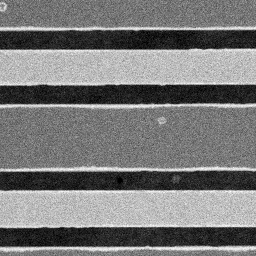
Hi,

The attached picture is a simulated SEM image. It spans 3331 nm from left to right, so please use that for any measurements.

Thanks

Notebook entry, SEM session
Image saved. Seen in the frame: lines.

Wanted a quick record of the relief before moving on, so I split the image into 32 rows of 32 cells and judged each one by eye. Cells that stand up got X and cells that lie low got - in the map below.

XXXXXXXXXXXXXXXXXXXXXXXXXXXXXXXX
XXXXXXXXXXXXXXXXXXXXXXXXXXXXXXXX
XXXXXXXXXXXXXXXXXXXXXXXXXXXXXXXX
XXXXXXXXXXXXXXXXXXXXXXXXXXXXXXXX
--------------------------------
--------------------------------
XXXXXXXXXXXXXXXXXXXXXXXXXXXXXXXX
XXXXXXXXXXXXXXXXXXXXXXXXXXXXXXXX
XXXXXXXXXXXXXXXXXXXXXXXXXXXXXXXX
XXXXXXXXXXXXXXXXXXXXXXXXXXXXXXXX
XXXX--XXX-XX--------------------
--------------------------------
--------------------------------
XXXXXXXXXXXXXXXXXXXXXXXXXXXXXXXX
XXXXXXXXXXXXXXXXXXXXXXXXXXXXXXXX
XXXXXXXXXXXXXXXXXXXXXXXXXXXXXXXX
XXXXXXXXXXXXXXXXXXXXXXXXXXXXXXXX
XXXXXXXXXXXXXXXXXXXXXXXXXXXXXXXX
XXXXXXXXXXXXXXXXXXXXXXXXXXXXXXXX
XXXXXXXXXXXXXXXXXXXXXXXXXXXXXXXX
XXXXXXXXXXXXXXXXXXXXXXXXXXXXXXXX
--------------------------------
--------------------------------
--------------------------------
XXXXXXXXXXXXXXXXXXXXXXXXXXXXXXXX
XXXXXXXXXXXXXXXXXXXXXXXXXXXXXXXX
XXXXXXXXXXXXXXXXXXXXXXXXXXXXXXXX
XXXXXXXXXXXXXXXXXXXXXXXXXXXXXXXX
--------------------------------
--------------------------------
--------------------------------
XXXXXXXXXXXXXXXXXXXXXXXXXXXXXXXX